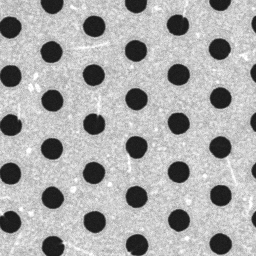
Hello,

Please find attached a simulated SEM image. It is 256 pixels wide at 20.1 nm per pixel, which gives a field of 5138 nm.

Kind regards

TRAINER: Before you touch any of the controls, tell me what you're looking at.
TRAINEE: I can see a regular array of holes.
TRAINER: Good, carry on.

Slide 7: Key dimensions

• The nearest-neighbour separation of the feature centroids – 966 nanometers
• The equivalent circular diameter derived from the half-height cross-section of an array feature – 450 nanometres